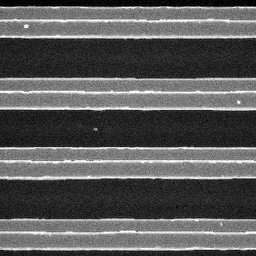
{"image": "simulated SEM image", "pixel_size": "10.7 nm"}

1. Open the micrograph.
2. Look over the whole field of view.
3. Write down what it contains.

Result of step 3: lines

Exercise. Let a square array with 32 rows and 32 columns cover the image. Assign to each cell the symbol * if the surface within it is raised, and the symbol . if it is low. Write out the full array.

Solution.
................................
********************************
********************************
********************************
********************************
................................
................................
................................
................................
................................
********************************
********************************
********************************
********************************
................................
................................
................................
................................
***********.******...*****...**.
********************************
********************************
********************************
................................
................................
................................
................................
................................
................................
********************************
********************************
********************************
................................